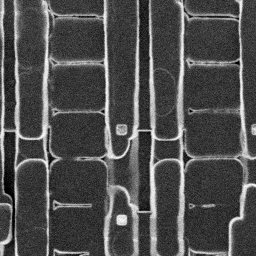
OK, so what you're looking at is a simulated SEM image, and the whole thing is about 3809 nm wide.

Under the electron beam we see wiring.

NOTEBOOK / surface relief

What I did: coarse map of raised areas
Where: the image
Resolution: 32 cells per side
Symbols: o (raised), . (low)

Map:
..ooo........oooo..oooo.......oo
..oooo.......oooo..oooo.......oo
..oooo.......oooo..oooo.......oo
..oooo.......oooo..oooo.......oo
..oooo.......oooo..oooo.......oo
..oooo.......oooo..oooo.......oo
..oooo.......oooo..oooo.......oo
..oooo.......oooo..oooo.......oo
..oooo.......oooo..oooo.......oo
..oooo.......oooo..oooo.......oo
..oooo.......oooo..oooo.......oo
..oooo.......oooo..oooo.......oo
..oooo.......oooo..oooo.......oo
..oooo.......oooo..oooo.......oo
..oooo.......oooo..oooo.......oo
..oooo.......oooo..oooo.......oo
..oooo.......oooo..oooo.......oo
..ooo........ooo...ooo........oo
..oooo........oo...ooo.........o
...ooo........o....ooo.........o
..oooo.............oooo.........
..oooo.............oooo.........
..oooo.............oooo.........
..oooo........o....oooo........o
o.oooo........oo...oooo.......oo
oooooo........oo...oooo.......oo
oooooo........ooo..oooo.......oo
oooooo.......oo.o..oooo......ooo
oooooo.......oooo..oooo......ooo
o.oooo.......oooo..oooo......ooo
o.oooo.......oooo..oooo......ooo
..oooo.......oooo..oooo......ooo